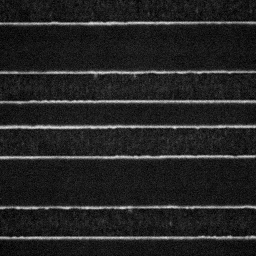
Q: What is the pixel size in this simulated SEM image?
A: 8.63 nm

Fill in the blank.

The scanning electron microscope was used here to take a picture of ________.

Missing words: lines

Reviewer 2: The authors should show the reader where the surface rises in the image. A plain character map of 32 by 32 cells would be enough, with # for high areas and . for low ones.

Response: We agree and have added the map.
................................
................................
................................
################################
################################
################################
################################
################################
################################
................................
................................
................................
................................
################################
################################
################################
................................
................................
................................
................................
################################
################################
################################
################################
################################
################################
................................
................................
................................
................................
################################
################################